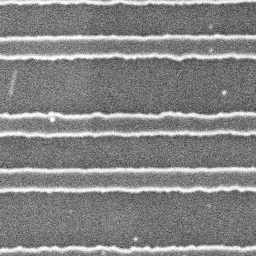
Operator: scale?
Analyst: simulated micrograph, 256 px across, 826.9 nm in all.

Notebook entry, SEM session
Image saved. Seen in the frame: lines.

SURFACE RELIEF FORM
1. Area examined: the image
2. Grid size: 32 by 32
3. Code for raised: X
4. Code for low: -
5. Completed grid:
--------------------------------
--------------------------------
--------------------------------
--------------------------------
--------------------X-----XX----
XXXXXXXXXXXXXXXXXXXXXXXXXXXXXXXX
XXXXXXXXXXXXXXXXXXXXXXXXXXXXXXXX
--------------------------------
--------------------------------
--------------------------------
--------------------------------
--------------------------------
--------------------------------
--------------------------------
XXXXXXXXXXXXXXXXXXXXXXXXXXXXXXXX
XXXXXXXXXXXXXXXXXXXXXXXXXXXXXXXX
XXXXXXXXXXXXXXXXXXXXXXXXXXXXXXXX
--------------------------------
--------------------------------
--------------------------------
--------------------------------
XXXXXXXXXXXXXXXXXXXXXXXXXXXXXXXX
XXXXXXXXXXXXXXXXXXXXXXXXXXXXXXXX
XXXXXXXXXXXXXXXXXXXXXXXXXXXXXXXX
--------------------------------
--------------------------------
--------------------------------
--------------------------------
--------------------------------
--------------------------------
--------------------------------
XXXXXXXXXXXXXXXXXXXXXXXXXXXXXXXX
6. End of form